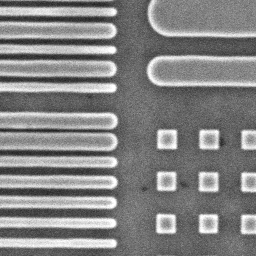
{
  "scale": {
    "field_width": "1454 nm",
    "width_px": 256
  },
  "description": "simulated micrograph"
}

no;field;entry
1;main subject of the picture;groups of lines, slits or small figures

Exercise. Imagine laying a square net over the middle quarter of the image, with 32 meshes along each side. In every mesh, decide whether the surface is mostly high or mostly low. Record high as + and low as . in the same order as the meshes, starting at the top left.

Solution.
+++++++++++++........+++++++++++
+++++++++++++........+++++++++++
++++++++++++.........+++++++++++
......................++++++++++
......................++++++++++
+++++++++++++...................
+++++++++++++...................
................................
................................
................................
................................
................................
................................
+++++++++++++...................
+++++++++++++...................
+++++++++++++...................
................................
+++++++.................++++....
+++++++++++++...........++++....
+++++++++++++..........+++++....
+++++++++++++..........+++++....
................................
................................
++++............................
+++++++++++++...................
++++++++++++....................
................................
.......................+++++....
+++++++++++++..........+++++....
+++++++++++++..........+++++....
+++++++++++++..........+++++....
................................